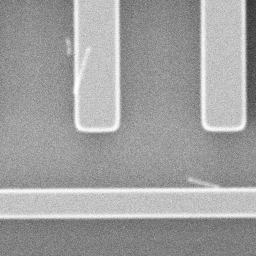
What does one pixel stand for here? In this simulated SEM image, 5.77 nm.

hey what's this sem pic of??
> groups of lines, slits or small figures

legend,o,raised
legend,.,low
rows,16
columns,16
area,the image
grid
.....oo......oo.
.....oo......oo.
.....oo......oo.
.....oo......oo.
.....oo......oo.
.....oo......oo.
.....oo......oo.
.....oo......oo.
................
................
................
................
oooooooooooooooo
oooooooooooooooo
................
................